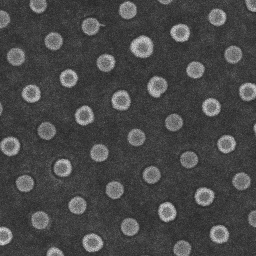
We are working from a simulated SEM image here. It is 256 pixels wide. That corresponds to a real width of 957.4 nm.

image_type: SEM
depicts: a regular array of raised bodies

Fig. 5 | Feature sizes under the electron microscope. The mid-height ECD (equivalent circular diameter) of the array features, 64.4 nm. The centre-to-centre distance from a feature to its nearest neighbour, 149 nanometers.